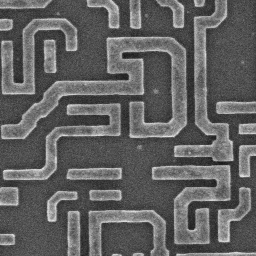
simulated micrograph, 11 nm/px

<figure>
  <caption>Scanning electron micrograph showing wiring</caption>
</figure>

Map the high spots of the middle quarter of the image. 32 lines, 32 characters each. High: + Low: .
...........+++++++++.......+++..
...........+++++++++.......+++..
................++++.......+++..
................++++.......+++..
++++++++++++++++++++.......+++..
++++++++++++++++++++.......+++..
++++++++++++++++++++.......++++.
++++++++++++++++++++.......++++.
...........................++++.
...........................++++.
.+++++++++++++...+++.......++++.
.+++++++++++++...+++.......++++.
.+++++++++++++...+++.......++++.
............++...+++.......++++.
............++...+++......+++++.
...+++..++++++...+++++++++++++..
++++++++++++++...++++++++++++...
++++++++++++++...+++++++++++....
................................
................................
............................++++
............................++++
............................++++
................................
................................
..............................++
.+++++++++++++........++++++++++
.+++++++++++++........++++++++++
.+++++++++++++........++++++++++
................................
................................
..............................++